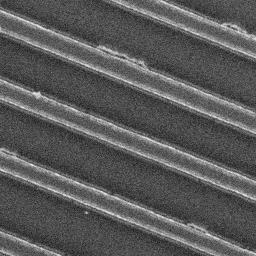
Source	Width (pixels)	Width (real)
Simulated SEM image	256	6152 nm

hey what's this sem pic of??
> lines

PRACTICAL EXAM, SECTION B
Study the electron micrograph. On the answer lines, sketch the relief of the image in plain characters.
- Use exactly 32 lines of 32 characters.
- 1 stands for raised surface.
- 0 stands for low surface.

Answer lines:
00000000000000011111100000000000
00000000000000000011111000000000
11100000000000000000111111000000
11111000000000000000000111111000
00111111000000000000000001111110
00001111110000000000000000001111
00000001111110000000000000000011
00000000011111100000000000000000
00000000000011111100000000000000
00000000000000111111000000000000
10000000000000000111111000000000
11110000000000000001111110000000
11111100000000000000011111110000
00011111100000000000000011111100
00000011111000000000000000011111
00000000111111000000000000000111
00000000001111110000000000000001
00000000000001111110000000000000
00000000000000001111110000000000
10000000000000000011111100000000
11110000000000000000011111000000
01111100000000000000000111111000
00011111100000000000000000111110
00000011111000000000000000001111
00000000111111000000000000000001
00000000000111110000000000000000
00000000000001111110000000000000
00000000000000001111100000000000
00000000000000000011111100000000
10000000000000000000011111000000
11110000000000000000000111111000
11111110000000000000000000111110